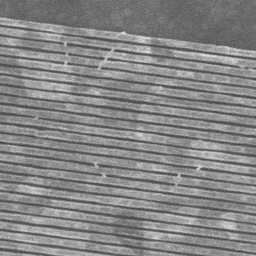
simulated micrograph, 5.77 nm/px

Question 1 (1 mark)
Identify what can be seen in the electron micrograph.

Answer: parallel lines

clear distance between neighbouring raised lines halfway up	0.02	micrometres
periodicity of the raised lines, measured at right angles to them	0.0555	micrometres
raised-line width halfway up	35.7	nanometers